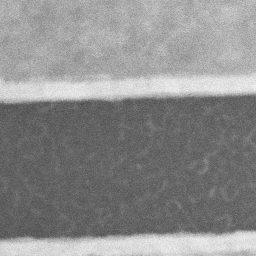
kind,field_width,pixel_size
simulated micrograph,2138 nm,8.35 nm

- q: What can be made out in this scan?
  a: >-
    one or a few lines or trenches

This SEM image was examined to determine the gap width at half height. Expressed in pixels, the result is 158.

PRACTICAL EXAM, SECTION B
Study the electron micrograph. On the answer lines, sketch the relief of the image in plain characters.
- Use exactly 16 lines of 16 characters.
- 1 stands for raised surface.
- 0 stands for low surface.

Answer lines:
1111111111111111
1111111111111111
1111111111111111
1111111111111111
1111111111111111
1111111100000000
0000000000000000
0000000000000000
0000000000000000
0000000000000000
0000000000000000
0000000000000000
0000000000000000
0000000000000000
0000000000000000
0000011111111111